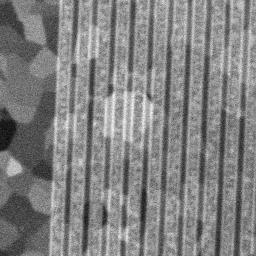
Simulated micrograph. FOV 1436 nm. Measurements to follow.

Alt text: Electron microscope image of parallel lines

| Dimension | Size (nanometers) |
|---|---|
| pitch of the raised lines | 106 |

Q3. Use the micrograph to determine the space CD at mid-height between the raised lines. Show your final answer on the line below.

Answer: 0.0616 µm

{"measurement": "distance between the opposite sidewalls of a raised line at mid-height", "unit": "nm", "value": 46.9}